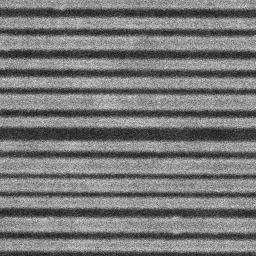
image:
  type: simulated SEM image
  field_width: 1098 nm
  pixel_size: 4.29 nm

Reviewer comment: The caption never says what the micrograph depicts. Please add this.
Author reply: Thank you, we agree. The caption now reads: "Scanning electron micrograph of parallel lines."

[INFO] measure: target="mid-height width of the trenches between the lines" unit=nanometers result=36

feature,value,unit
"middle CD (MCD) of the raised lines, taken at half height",43.5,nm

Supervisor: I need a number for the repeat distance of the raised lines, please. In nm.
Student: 86.7